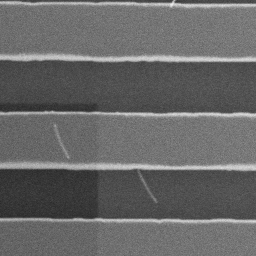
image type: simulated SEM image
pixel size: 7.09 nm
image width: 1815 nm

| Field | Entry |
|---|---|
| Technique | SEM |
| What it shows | lines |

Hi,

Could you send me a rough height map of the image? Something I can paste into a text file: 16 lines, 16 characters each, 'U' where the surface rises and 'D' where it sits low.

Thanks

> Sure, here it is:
UUUUUUUUUUUUUUUU
UUUUUUUUUUUUUUUU
UUUUUUUUUUUUUUUU
UUUUUUUUUUUUUUUU
DDDDDDDDDDDDDDDD
DDDDDDDDDDDDDDDD
DDDDDDDDDDDDDDDD
UUUUUUUUUUUUUUUU
UUUUUUUUUUUUUUUU
UUUUUUUUUUUUUUUU
DDDDUUUUUUUUUUUU
DDDDDDDDDDDDDDDD
DDDDDDDDDDDDDDDD
DDDDDDDDDDDDDDDD
UUUUUUUUUUUUUUUU
UUUUUUUUUUUUUUUU